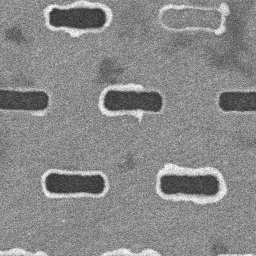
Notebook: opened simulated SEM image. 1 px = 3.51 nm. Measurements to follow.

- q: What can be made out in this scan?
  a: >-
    holes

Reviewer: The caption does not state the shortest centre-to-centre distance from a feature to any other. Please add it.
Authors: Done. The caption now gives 352 nanometers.